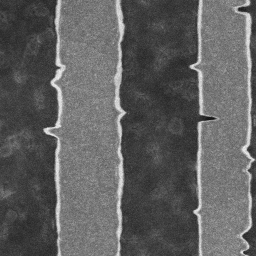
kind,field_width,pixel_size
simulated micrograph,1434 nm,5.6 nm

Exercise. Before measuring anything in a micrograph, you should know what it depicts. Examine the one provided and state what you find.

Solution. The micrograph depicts one or a few lines or trenches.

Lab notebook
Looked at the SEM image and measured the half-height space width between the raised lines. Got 450 nm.